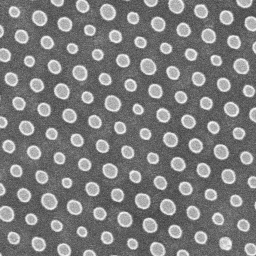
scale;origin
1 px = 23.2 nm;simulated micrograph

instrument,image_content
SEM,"a regular array of raised bodies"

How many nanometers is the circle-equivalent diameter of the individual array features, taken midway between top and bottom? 285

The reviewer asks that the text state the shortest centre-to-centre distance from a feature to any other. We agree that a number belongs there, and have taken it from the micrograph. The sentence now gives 589 nanometers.